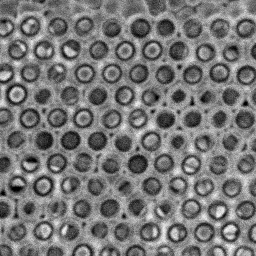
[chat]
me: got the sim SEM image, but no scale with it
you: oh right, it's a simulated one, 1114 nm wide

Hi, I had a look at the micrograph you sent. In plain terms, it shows a regular array of holes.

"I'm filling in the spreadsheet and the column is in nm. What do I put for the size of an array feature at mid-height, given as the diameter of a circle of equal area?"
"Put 86.4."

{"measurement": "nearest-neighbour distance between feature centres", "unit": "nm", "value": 110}